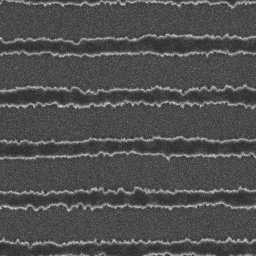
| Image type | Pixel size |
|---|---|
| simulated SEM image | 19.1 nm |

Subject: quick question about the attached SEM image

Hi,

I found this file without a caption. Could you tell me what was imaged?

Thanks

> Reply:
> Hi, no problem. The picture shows parallel lines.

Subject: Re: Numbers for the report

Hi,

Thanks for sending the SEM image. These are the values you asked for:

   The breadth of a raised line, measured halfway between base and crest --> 314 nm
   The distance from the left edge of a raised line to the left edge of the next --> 970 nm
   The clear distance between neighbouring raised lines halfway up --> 662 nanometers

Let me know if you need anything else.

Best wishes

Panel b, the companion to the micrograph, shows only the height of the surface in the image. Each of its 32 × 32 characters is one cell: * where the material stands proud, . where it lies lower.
....**.*****..........*.....**..
................................
................................
................................
..................******.*..*...
********************************
********************************
................................
................................
................................
................................
********************************
********************************
................................
................................
................................
................................
...........***************...**.
********************************
**********.*.........*.*.**.**..
................................
................................
................................
................................
********************************
***************************.****
................................
................................
................................
................................
*******.************************
********************************